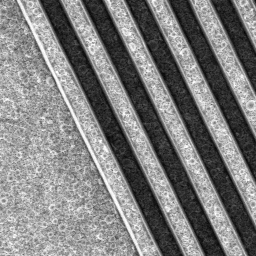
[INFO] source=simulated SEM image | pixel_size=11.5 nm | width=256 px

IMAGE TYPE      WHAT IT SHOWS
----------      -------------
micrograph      parallel lines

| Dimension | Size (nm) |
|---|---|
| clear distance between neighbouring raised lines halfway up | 236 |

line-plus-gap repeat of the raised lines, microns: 0.441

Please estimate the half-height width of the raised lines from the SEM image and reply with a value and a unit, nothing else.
0.213 µm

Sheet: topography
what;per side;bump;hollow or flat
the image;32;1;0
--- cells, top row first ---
00011000110001110001100011000111
00011100111000110001110011100011
00011100011000111000110001100011
00001100011100011000110001110001
00001110001100011100111000110001
00000110001110001100011100111000
00000111000110001110011100011000
00000011000111000110001100011100
00000011100011000111001110001100
00000001100011100011000110001110
00000001110001100011000111000110
00000000110001110001100011000111
00000000111000110001110011100011
00000000011000111000110001100011
00000000011100011000110001110001
00000000001100011100111000110001
00000000001110001100011000111000
00000000000110001110011100011000
00000000000111001110001100011100
00000000000011000111001110001100
00000000000011100011000110001110
00000000000001100011000111000110
00000000000001110001100011000111
00000000000000110001100011100011
00000000000000111000110001100011
00000000000000011000110001110001
00000000000000011100111000110001
00000000000000001100011000111000
00000000000000001110011100011000
00000000000000000110001100011100
00000000000000000111001110001100
00000000000000000111000110001110